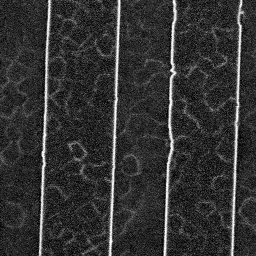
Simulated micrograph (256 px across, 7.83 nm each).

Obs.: one or a few lines or trenches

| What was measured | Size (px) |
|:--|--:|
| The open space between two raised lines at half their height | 54.2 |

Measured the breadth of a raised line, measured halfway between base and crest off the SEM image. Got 536 nanometers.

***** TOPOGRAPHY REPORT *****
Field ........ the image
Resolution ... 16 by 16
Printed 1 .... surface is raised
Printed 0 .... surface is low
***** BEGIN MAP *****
0001111000011110
0001111000011110
0001111000011110
0001111000011110
0001111000011110
0001111000011110
0001111000011110
0001111000011110
0001111000011110
0001111000011110
0001111000011110
0001111000111110
0001111000111110
0001111000111110
0001111000111110
0011111000111110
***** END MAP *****